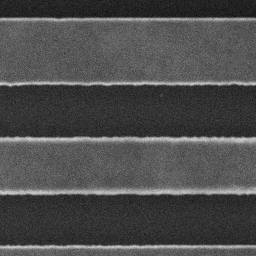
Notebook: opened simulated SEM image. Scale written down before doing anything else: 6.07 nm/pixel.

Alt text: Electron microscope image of lines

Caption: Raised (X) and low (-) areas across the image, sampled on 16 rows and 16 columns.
----------------
XXXXXXXXXXXXXXXX
XXXXXXXXXXXXXXXX
XXXXXXXXXXXXXXXX
XXXXXXXXXXXXXXXX
----------------
----------------
----------------
----------------
XXXXXXXXXXXXXXXX
XXXXXXXXXXXXXXXX
XXXXXXXXXXXXXXXX
----------------
----------------
----------------
XXXXXXXXXXXXXXXX